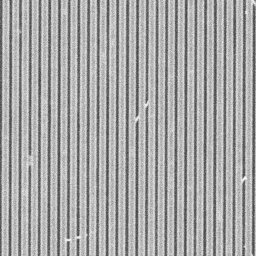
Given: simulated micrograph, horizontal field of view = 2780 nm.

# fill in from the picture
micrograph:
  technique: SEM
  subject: parallel lines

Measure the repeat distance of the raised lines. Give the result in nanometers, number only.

106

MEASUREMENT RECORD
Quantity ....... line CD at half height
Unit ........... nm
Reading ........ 65.1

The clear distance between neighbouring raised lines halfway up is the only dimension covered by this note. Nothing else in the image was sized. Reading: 36.6 nm